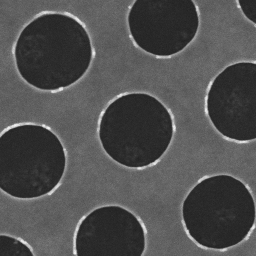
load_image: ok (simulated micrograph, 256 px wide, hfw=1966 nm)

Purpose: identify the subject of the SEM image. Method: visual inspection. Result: holes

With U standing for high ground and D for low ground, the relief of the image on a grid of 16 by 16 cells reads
UUUUUUUUDDDDUUUD
UUDDDUUUDDDDUUUU
UDDDDDUUDDDDUUUU
UDDDDDUUUUUUUUUU
UDDDDUUUUUUUUUDD
UUDDUUUUUUUUUDDD
UUUUUUUDDDUUUDDD
UUUUUUDDDDDUUDDD
DDDUUUDDDDDUUUDD
DDDDUUUDDDUUUUUU
DDDDUUUUUUUUUUUU
DDDDUUUUUUUUDDDU
UUUUUUUUUUUUDDDD
UUUUUUDDUUUDDDDD
UUUUUDDDDUUUDDDD
DDUUUDDDDUUUUDUU